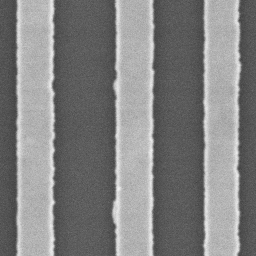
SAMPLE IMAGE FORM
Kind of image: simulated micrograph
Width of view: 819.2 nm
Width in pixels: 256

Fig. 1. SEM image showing lines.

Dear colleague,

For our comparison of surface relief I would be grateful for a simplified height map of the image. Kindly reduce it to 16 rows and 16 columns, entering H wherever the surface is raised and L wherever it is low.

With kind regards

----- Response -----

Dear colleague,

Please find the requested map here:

LHHLLLLHHHLLLHHL
LHHLLLLHHHLLLHHL
LHHLLLLHHHLLLHHL
LHHLLLLHHHLLLHHL
LHHLLLLHHHLLLHHL
LHHLLLLHHHLLLHHL
LHHLLLLHHHLLLHHL
LHHLLLLHHHLLLHHL
LHHLLLLHHHLLLHHL
LHHLLLLHHHLLLHHL
LHHLLLLHHHLLLHHL
LHHLLLLHHHLLLHHL
LHHLLLLHHHLLLHHL
LHHLLLLHHLLLLHHL
LHHLLLLHHHLLLHHL
LHHLLLLHHHLLLHHL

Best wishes